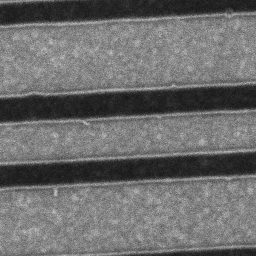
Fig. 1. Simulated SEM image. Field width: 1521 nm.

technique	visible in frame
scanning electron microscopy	one or a few lines or trenches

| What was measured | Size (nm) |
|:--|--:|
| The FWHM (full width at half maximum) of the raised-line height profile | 160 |